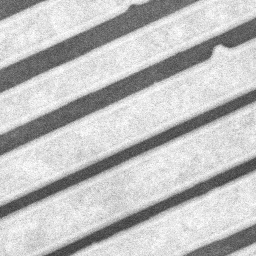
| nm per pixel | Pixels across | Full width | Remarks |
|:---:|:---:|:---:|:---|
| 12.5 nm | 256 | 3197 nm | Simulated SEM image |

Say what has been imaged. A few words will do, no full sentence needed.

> one or a few lines or trenches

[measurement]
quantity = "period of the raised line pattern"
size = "760 nm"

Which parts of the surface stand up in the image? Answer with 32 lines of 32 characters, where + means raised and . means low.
......++++++++++.........+++++++
...++++++++++++........+++++++++
.++++++++++++........+++++++++..
++++++++++........++++++++++....
++++++++........++++++++++......
++++++........++++++++++.......+
++++........++++++++++.....+++++
++........+++++++++.......++++++
........+++++++++........+++++++
......+++++++++........+++++++++
...++++++++++.......++++++++++++
.++++++++++.......++++++++++++..
++++++++........++++++++++++....
++++++........++++++++++++.....+
++++........++++++++++++.....+++
++........+++++++++++......+++++
.......++++++++++++.....++++++++
.....++++++++++++.....++++++++++
...++++++++++++.....++++++++++++
.++++++++++++.....+++++++++++++.
+++++++++++.....+++++++++++++...
++++++++......+++++++++++++.....
++++++.....++++++++++++++.....++
++++......+++++++++++++.....++++
++.....++++++++++++++.....++++++
.....+++++++++++++......++++++++
...+++++++++++++.....+++++++++++
.+++++++++++++.....+++++++++++++
++++++++++++.....+++++++++++++..
++++++++++.....+++++++++++++....
++++++++....+++++++++++++.......
++++++....+++++++++++++.......++